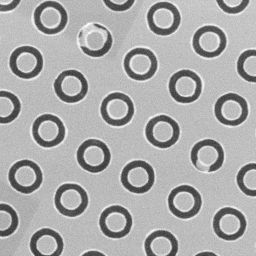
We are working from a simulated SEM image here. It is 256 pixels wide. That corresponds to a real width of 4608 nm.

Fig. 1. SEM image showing a regular array of ring-shaped grooves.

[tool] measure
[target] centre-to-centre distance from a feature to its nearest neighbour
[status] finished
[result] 893 nanometres